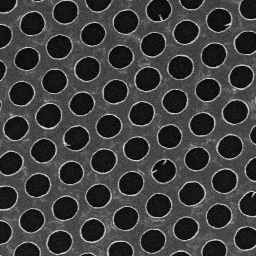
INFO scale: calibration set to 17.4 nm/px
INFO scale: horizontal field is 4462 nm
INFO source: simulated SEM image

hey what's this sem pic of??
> a regular array of holes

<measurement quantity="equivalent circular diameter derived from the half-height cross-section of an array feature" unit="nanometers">419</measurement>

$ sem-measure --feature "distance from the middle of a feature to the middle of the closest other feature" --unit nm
606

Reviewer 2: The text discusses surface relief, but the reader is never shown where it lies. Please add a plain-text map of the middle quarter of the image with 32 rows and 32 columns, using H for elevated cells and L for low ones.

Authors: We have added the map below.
HHHLLLLLLHHHLLLLHHHHHHHHHHLLLLLL
HHHLLLLLLHHHHHHHHHHLLLLHHHLLLLLL
HHHLLLLLLHHHHHHHHHLLLLLLHHHLLLLL
LHHHLLLLHHHHHHHHHHLLLLLLHHHLLLHH
LHHHHHHHHHHLLLLHHHLLLLLLHHHHHHHH
LHHHHHHHHHLLLLLLHHLLLLLHHHHHHHHH
HHHHHHHHHHLLLLLLHHHLLLHHHHHLLHHH
HHHLLLHHHHLLLLLLHHHHHHHHHHLLLLHH
HHLLLLLHHHLLLLLHHHHHHHHHHLLLLLLH
HLLLLLLLHHHLLLHHHHHHHHHHLLLLLLLH
HLLLLLLHHHHHHHHHHLLLLLHHHLLLLLLH
HHLLLLLHHHHHHHHHHLLLLLHHHHLLLLHH
HHHLLLHHHHHHHHHHLLLLLLHHHHHHHHHH
HHHHHHHHHLLLLHHHLLLLLLHHHHHHHHHH
HHHHHHHHLLLLLLHHHLLLLLHHHHHHHHHH
HHHLHHHHLLLLLLHHHHHHHHHHHLLLHHHL
HLLLLLHHLLLLLLHHHHHHHHHHLLLLLHHH
LLLLLLHHHLLLLHHHHHHHHHHLLLLLLHHH
LLLLLLHHHHLHHHHHHLLLHHHLLLLLLHHH
LLLLLLHHHHHHHHHHLLLLLHHHLLLLLHHH
HLLLLHHHHHHHHHHLLLLLLHHHHLLLHHHH
HHLLHHHHHLLHHHHLLLLLLHHHHHHHHHHH
HHHHHHHHLLLLLHHLLLLLLHHHHHHHHHHL
HHHHHHHLLLLLLHHHLLLLHHHHHHHHHHLL
HLHHHHHLLLLLLHHHHHHHHHHLLLLHHHLL
LLLLHHHLLLLLLHHHHHHHHHLLLLLLHHHL
LLLLLHHHLLLLHHHHHHHHHHLLLLLLHHHH
LLLLLHHHHHHHHHHLLLLHHHLLLLLLHHHH
LLLLHHHHHHHHHHLLLLLLHHLLLLLHHHHH
LLLHHHHHHHHHHHLLLLLLHHHHLLHHHHHH
HHHHHHHLLLHHHHLLLLLLHHHHHHHHHHLL
HHHHHHLLLLLHHHLLLLLHHHHHHHHHHLLL